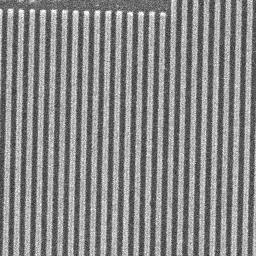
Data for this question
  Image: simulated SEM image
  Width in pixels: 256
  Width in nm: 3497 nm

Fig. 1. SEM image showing parallel lines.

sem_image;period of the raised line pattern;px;10.9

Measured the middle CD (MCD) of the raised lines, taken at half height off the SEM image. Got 66.6 nanometers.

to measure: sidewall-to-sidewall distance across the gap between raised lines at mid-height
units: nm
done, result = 81.9